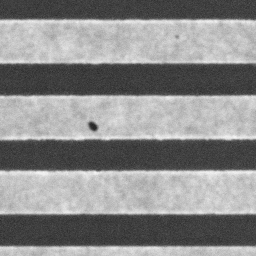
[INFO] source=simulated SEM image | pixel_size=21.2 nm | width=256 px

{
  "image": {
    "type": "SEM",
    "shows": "lines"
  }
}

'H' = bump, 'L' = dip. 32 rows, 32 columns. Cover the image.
LLLLLLLLLLLLLLLLLLLLLLLLLLLLLLLL
LLLLLLLLLLLLLLLLLLLLLLLLLLLLLLLL
LLLLLLLLLLLLLLLLLLLLLLLLLLLLLLLL
HHHHHHHHHHHHHHHHHHHHHHHHHHHHHHHH
HHHHHHHHHHHHHHHHHHHHHHHHHHHHHHHH
HHHHHHHHHHHHHHHHHHHHHHHHHHHHHHHH
HHHHHHHHHHHHHHHHHHHHHHHHHHHHHHHH
HHHHHHHHHHHHHHHHHHHHHHHHHHHHHHHH
LLLLLLLLLLLLLLLLLLLLLLLLLLLLLLLL
LLLLLLLLLLLLLLLLLLLLLLLLLLLLLLLL
LLLLLLLLLLLLLLLLLLLLLLLLLLLLLLLL
LLLLLLLLLLLLLLLLLLLLLLLLLLLLLLLL
HHHHHHHHHHHHHHHHHHHHHHHHHHHHHHHH
HHHHHHHHHHHHHHHHHHHHHHHHHHHHHHHH
HHHHHHHHHHHHHHHHHHHHHHHHHHHHHHHH
HHHHHHHHHHHHHHHHHHHHHHHHHHHHHHHH
HHHHHHHHHHHHHHHHHHHHHHHHHHHHHHHH
LLLLLLLLLLLLLLLLLLLLLLLLLLLLLLLL
LLLLLLLLLLLLLLLLLLLLLLLLLLLLLLLL
LLLLLLLLLLLLLLLLLLLLLLLLLLLLLLLL
LLLLLLLLLLLLLLLLLLLLLLLLLLLLLLLL
LLHLLLLHLHLHLHLLLLLHHLHLLHHHHHHH
HHHHHHHHHHHHHHHHHHHHHHHHHHHHHHHH
HHHHHHHHHHHHHHHHHHHHHHHHHHHHHHHH
HHHHHHHHHHHHHHHHHHHHHHHHHHHHHHHH
HHHHHHHHHHHHHHHHHHHHHHHHHHHHHHHH
HHHHHHHHHHHHHHHHHHHHHHHHHHHHHHHH
LLLLLLLLLLLLLLLLLLLLLLLLLLLLLLLL
LLLLLLLLLLLLLLLLLLLLLLLLLLLLLLLL
LLLLLLLLLLLLLLLLLLLLLLLLLLLLLLLL
LLLLLLLLLLLLLLLLLLLLLLLLLLLLLLLL
HHHHHHHHHHHHHHHHHHHHHHHHHHHHHHHH